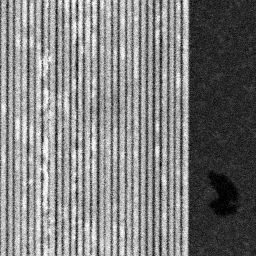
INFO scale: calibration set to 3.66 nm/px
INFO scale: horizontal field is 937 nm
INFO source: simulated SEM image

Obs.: parallel lines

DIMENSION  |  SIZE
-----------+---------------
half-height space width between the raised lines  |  6.9 nm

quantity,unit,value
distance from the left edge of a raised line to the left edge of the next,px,6.97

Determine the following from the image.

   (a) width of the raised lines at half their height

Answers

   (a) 17.4 nanometers